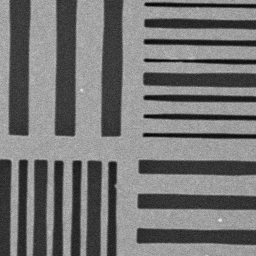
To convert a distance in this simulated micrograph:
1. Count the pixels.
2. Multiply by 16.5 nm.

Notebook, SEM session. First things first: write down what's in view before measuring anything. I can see groups of lines, slits or small figures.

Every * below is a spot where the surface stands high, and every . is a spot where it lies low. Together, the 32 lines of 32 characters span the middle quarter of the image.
...******......*****************
...******......*****************
...******......*****............
...******......*****............
...******......*****............
...******......*****............
...******......*****************
...******......**********.....**
...******......*****............
...******......***********......
...******......*****************
...******......*****************
...******......******...........
...******.....******............
...******.....******************
...******.....******************
...******.....******************
...******.....******............
***********************.........
********************************
********************************
********************************
********************************
********************************
**..**...**..******.............
**...*....*..******.............
**...*....*..*****..............
**...*....*..******.............
**...*....*..*******************
**...*....*..*******************
**..**....*..*******************
**..**...**..*******************